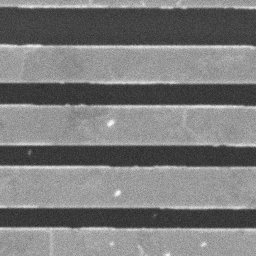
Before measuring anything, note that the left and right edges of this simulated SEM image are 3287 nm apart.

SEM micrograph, lines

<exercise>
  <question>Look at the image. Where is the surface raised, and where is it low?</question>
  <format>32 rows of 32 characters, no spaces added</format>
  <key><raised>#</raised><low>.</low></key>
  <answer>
################################
................................
................................
................................
................................
................................
################################
################################
################################
################################
................................
................................
................................
################################
################################
################################
################################
################################
................................
................................
................................
################################
################################
################################
################################
################################
................................
................................
................................
################################
################################
################################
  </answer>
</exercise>